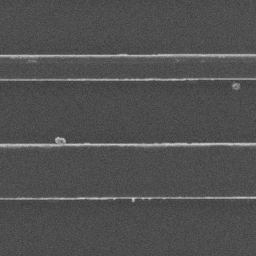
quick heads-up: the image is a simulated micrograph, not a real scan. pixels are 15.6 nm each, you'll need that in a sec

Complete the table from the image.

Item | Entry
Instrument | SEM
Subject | lines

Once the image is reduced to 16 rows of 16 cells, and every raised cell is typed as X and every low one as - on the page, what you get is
----------------
----------------
----------------
XXXXXXXXXXXXXXXX
XXXXXXXXXXXXXXXX
----------------
----------------
----------------
----------------
XXXXXXXXXXXXXXXX
XXXXXXXXXXXXXXXX
XXXXXXXXXXXXXXXX
----------------
----------------
----------------
----------------